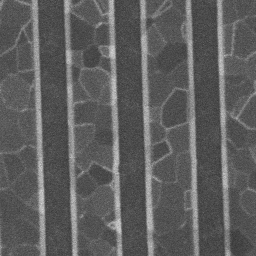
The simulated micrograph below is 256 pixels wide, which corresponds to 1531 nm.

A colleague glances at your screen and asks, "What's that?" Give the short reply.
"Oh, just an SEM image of one or a few lines or trenches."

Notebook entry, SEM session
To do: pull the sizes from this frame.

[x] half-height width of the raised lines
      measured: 271 nm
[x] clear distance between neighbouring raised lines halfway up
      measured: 184 nm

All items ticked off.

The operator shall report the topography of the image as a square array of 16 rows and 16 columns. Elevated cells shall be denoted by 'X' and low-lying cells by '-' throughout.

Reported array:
XX--XXX--XXX--XX
XX--XXX--XXX--XX
XX--XXX--XXX--XX
XX--XXX--XXX--XX
XX--XXX--XXX--XX
XX--XXX--XXX--XX
XX--XXX--XXX--XX
XX--XXX--XXX--XX
XX--XXX--XXX--XX
XX--XXX--XXX--XX
XXX-XXX--XXX--XX
XXX--XX--XXX--XX
XXX--XX--XXX--XX
XXX--XX--XXX--XX
XXX--XX--XXX--XX
XXX--XX--XXX--XX